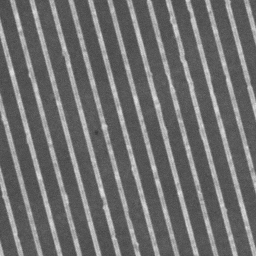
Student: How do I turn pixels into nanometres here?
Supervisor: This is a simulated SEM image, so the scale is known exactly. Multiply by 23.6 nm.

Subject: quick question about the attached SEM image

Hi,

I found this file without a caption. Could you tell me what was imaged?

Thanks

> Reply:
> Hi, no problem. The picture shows parallel lines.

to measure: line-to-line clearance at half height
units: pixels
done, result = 15.6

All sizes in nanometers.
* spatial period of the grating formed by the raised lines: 444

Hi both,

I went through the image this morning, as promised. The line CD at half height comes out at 79.7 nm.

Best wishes